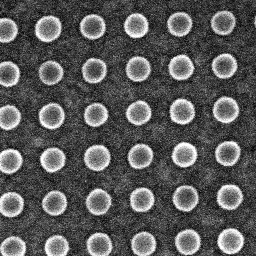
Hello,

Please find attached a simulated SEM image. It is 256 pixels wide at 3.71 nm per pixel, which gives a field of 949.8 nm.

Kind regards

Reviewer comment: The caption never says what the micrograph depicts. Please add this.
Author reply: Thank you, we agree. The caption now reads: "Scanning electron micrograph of a regular array of raised bodies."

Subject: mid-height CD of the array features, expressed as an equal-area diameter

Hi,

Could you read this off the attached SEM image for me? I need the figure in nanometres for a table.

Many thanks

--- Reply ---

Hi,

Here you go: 88.4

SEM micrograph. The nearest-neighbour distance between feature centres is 160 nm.